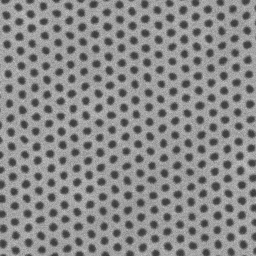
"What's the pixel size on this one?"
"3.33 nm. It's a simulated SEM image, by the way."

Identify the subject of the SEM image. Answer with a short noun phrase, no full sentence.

a regular array of holes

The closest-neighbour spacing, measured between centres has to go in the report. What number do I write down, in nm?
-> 47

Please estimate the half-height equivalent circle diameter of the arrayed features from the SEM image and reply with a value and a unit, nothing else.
28.9 nm